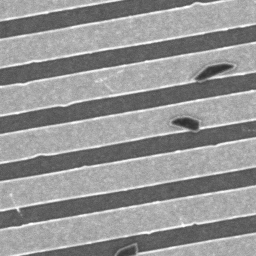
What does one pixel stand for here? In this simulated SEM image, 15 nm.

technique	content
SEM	parallel lines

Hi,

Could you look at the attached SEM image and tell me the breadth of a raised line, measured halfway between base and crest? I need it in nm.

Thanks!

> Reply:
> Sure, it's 435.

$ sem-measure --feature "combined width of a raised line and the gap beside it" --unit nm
701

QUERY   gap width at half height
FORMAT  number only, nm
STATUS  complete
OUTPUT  267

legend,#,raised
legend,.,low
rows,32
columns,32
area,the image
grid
############............########
######..............############
#.............##################
.........####################...
...####################.........
##################.............#
############.............#######
######.............#############
.............###################
........####################....
..#####################.........
#################..............#
###########..............#######
#####...............############
.............###################
........#####################...
..#####################.........
#################.............##
############.............#######
#####..............#############
.............###################
.......#####################....
..####################..........
#################.............##
###########..............#######
####..............##############
............####################
.......#####################....
.#####################..........
################..............##
###########.............########
#####..........##..#############